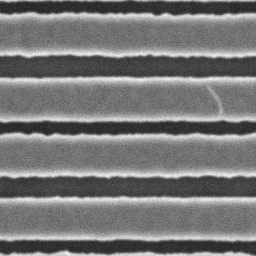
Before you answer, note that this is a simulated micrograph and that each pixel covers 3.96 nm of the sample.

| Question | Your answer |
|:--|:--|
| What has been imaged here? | lines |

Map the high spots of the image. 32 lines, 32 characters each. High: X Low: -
--------------------------------
--------------------------------
XXXXXXXXXXXXXXXXXXXXXXXXXXXXXXXX
XXXXXXXXXXXXXXXXXXXXXXXXXXXXXXXX
XXXXXXXXXXXXXXXXXXXXXXXXXXXXXXXX
XXXXXXXXXXXXXXXXXXXXXXXXXXXXXXXX
XXXXXXXXXXXXXXXXXXXXXXXXXXXXXXXX
--------------------------------
--------------------------------
--------------------------------
XXXXXXXXXXXXXXXXXXXXXXXXXXXXXXXX
XXXXXXXXXXXXXXXXXXXXXXXXXXXXXXXX
XXXXXXXXXXXXXXXXXXXXXXXXXXXXXXXX
XXXXXXXXXXXXXXXXXXXXXXXXXXXXXXXX
XXXXXXXXXXXXXXXXXXXXXXXXXXXXXXXX
--------------------------------
--------------------------------
XXXXXXXXXXXXXXXXXXXXXXXXXXXXXXXX
XXXXXXXXXXXXXXXXXXXXXXXXXXXXXXXX
XXXXXXXXXXXXXXXXXXXXXXXXXXXXXXXX
XXXXXXXXXXXXXXXXXXXXXXXXXXXXXXXX
XXXXXXXXXXXXXXXXXXXXXXXXXXXXXXXX
--------------------------------
--------------------------------
--------------------------------
XXXXXXXXXXXXXXXXXXXXXXXXXXXXXXXX
XXXXXXXXXXXXXXXXXXXXXXXXXXXXXXXX
XXXXXXXXXXXXXXXXXXXXXXXXXXXXXXXX
XXXXXXXXXXXXXXXXXXXXXXXXXXXXXXXX
XXXXXXXXXXXXXXXXXXXXXXXXXXXXXXXX
--------------------------------
--------------------------------